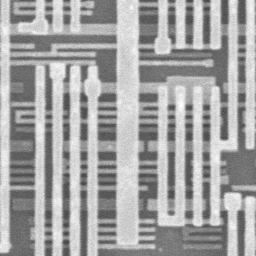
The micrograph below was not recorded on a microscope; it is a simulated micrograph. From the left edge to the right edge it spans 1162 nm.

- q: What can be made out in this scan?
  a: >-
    wiring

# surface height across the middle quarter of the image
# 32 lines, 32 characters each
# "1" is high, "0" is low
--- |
00000000000000111100000000000000
00110011000000111100000000000000
00110011000000111100000000000000
00110011000000111110000000000000
00110111100000111110000000000000
00110111100000111100000000000000
00110111100001111100000011001100
00110111100001111100000011001100
00110011000001111100000011001100
00110011000001111100000011001100
00110011000001111100000011001100
00110011000000111100000011001100
00110011000000111100000011001100
00110011000000111100000011001100
00110011000001111100000011001100
00110011000001111100000011001100
00110011000001111100000011001100
00110011000001111100000011001100
00110011000001111100000011001100
00110011000001111100000011001100
00110011000001111100000011001100
00110011000001111100000011001100
00110011000001111100000011001100
00110011000001111100000111001100
00110011000001111100000111001100
00110011000001111100000111001100
00110011000001111100000111001100
00110011000001111100000111001100
00110011000001111100000011001100
00110011000001111100000011001100
00110011000001111100000011001100
00110011000001111100000011001100